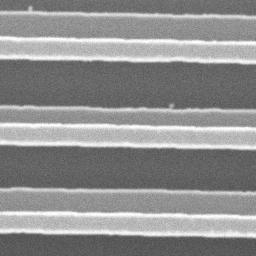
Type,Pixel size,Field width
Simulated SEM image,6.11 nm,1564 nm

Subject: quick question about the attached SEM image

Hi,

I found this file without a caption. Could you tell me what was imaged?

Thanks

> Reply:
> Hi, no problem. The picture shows lines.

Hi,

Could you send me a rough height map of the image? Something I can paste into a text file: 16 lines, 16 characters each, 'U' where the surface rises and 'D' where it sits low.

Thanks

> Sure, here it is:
DDDDDDDDDDDDDDDD
UUUUUUUUUUUUUUUU
UUUUUUUUUUUUUUUU
UUUUUUUUUUUUUUUU
DDDDDDDDDDDDDDDD
DDDDDDDDDDDDDDDD
DDDDDDDDDDDDDDDD
UUUUUUUUUUUUUUUU
UUUUUUUUUUUUUUUU
DDDDDDDDDDDDDDDD
DDDDDDDDDDDDDDDD
DDDDDDDDDDDDDDDD
UUUUUUUUUUUUUUUU
UUUUUUUUUUUUUUUU
UUUUUUUUUUUUUUUU
DDDDDDDDDDDDDDDD